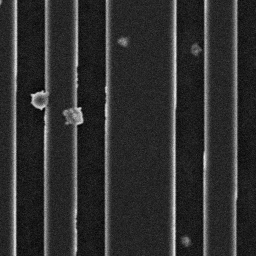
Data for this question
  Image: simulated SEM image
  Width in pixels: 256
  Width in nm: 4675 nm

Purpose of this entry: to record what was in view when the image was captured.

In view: lines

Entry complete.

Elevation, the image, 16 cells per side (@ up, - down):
@--@@--@@@@--@@-
@--@@--@@@@--@@-
@--@@--@@@@--@@-
@--@@--@@@@--@@-
@--@@--@@@@--@@-
@--@@--@@@@--@@-
@-@@@--@@@@--@@-
@--@@--@@@@--@@-
@--@@--@@@@--@@-
@--@@--@@@@--@@-
@--@@--@@@@--@@-
@--@@--@@@@--@@-
@--@@--@@@@--@@-
@--@@--@@@@--@@-
@--@@--@@@@--@@-
@--@@--@@@@--@@-